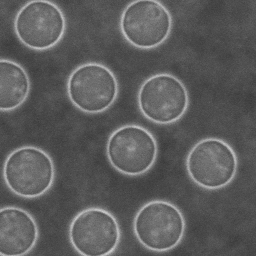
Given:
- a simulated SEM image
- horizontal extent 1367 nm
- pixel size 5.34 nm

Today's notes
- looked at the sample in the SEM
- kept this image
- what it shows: a regular array of holes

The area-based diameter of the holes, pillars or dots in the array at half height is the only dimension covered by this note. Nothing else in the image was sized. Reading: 245 nm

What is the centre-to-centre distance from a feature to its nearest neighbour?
0.423 um